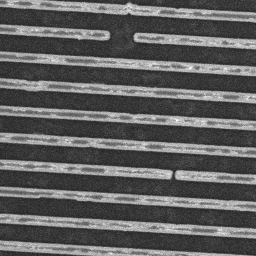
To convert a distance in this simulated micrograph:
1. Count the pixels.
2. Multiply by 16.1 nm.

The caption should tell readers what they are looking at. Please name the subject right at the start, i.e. parallel lines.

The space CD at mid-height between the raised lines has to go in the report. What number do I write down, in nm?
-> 324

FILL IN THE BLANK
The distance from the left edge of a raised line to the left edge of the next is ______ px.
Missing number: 27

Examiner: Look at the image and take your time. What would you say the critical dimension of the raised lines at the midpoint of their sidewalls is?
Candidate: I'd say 108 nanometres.